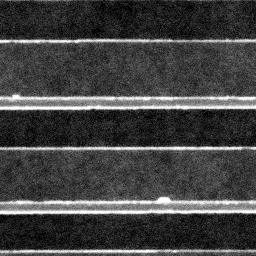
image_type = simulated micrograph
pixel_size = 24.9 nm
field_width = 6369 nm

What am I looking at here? lines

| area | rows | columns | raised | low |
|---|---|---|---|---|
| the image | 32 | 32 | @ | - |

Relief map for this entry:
--------------------------------
--------------------------------
--------------------------------
--------------------------------
--------------------------------
@@@@@@@@@@@@@@@@@@@@@@@@@@@@@@@@
@@@@@@@@@@@@@@@@@@@@@@@@@@@@@@@@
@@@@@@@@@@@@@@@@@@@@@@@@@@@@@@@@
@@@@@@@@@@@@@@@@@@@@@@@@@@@@@@@@
@@@@@@@@@@@@@@@@@@@@@@@@@@@@@@@@
@@@@@@@@@@@@@@@@@@@@@@@@@@@@@@@@
@@@@@@@@@@@@@@@@@@@@@@@@@@@@@@@@
@@@@@@@@@@@@@@@@@@@@@@@@@@@@@@@@
@--@-@@--@----------------------
--------------------------------
--------------------------------
--------------------------------
--------------------------------
-----------------------------@@@
@@@@@@@@@@@@@@@@@@@@@@@@@@@@@@@@
@@@@@@@@@@@@@@@@@@@@@@@@@@@@@@@@
@@@@@@@@@@@@@@@@@@@@@@@@@@@@@@@@
@@@@@@@@@@@@@@@@@@@@@@@@@@@@@@@@
@@@@@@@@@@@@@@@@@@@@@@@@@@@@@@@@
@@@@@@@@@@@@@@@@@@@@@@@@@@@@@@@@
@@@@@@@@@@@@@@@@@@@@@@@@@@@@@@@@
@@@@@@@@@@@@---@----------------
--------------------------------
--------------------------------
--------------------------------
--------------------------------
@@@@@@@@@@@@@@@@@@@@@@@@@@@@@@@@